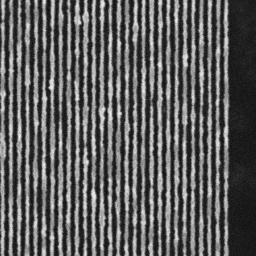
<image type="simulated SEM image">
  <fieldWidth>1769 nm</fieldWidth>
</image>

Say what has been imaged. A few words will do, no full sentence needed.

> parallel lines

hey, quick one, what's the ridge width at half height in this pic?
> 19 nm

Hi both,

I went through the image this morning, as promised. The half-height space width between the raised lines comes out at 37.2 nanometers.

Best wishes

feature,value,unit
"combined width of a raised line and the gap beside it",57.2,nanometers